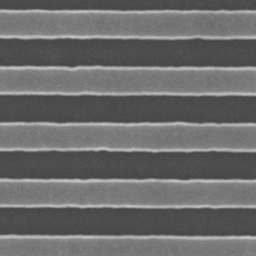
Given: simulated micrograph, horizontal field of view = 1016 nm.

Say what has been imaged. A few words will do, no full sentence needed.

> parallel lines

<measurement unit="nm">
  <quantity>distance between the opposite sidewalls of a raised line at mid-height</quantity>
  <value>107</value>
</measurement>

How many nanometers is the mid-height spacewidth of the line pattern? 118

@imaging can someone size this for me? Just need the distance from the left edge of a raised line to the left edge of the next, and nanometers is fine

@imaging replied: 224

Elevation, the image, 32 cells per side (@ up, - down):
--------------------------------
@@@@@@@@@@@@@@@@@--@@@@@@@@@@@@@
@@@@@@@@@@@@@@@@@@@@@@@@@@@@@@@@
@@@@@@@@@@@@@@@@@@@@@@@@@@@@@@@@
@@@@@@@@@@@@@@@@@@@@@@@@@@@@@@@@
--------------------------------
--------------------------------
--------------------------------
@@@@@-@@-@@@@@@@-@@@-@@@@@@@@---
@@@@@@@@@@@@@@@@@@@@@@@@@@@@@@@@
@@@@@@@@@@@@@@@@@@@@@@@@@@@@@@@@
@@@@@@@@@@@@@@@@@@@@@@@@@@@@@@@@
--------------------------------
--------------------------------
--------------------------------
@@@@@@@@----------@-@@@@--------
@@@@@@@@@@@@@@@@@@@@@@@@@@@@@@@@
@@@@@@@@@@@@@@@@@@@@@@@@@@@@@@@@
@@@@@@@@@@@@@@@@@@@@@@@@@@@@@@@@
--------------------------------
--------------------------------
--------------------------------
@-----@----@--@---@@------------
@@@@@@@@@@@@@@@@@@@@@@@@@@@@@@@@
@@@@@@@@@@@@@@@@@@@@@@@@@@@@@@@@
@@@@@@@@@@@@@@@@@@@@@@@@@@@@@@@@
--------------------------------
--------------------------------
--------------------------------
--------------------------------
@@@@@@@@@@@@@@@@@@@@@@@@@@@@@@@@
@@@@@@@@@@@@@@@@@@@@@@@@@@@@@@@@